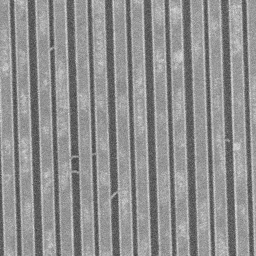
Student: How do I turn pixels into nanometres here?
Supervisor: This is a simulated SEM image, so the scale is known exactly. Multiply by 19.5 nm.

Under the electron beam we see parallel lines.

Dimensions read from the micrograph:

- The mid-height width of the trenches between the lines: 117 nm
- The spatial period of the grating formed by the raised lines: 379 nm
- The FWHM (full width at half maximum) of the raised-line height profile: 0.234 micrometres